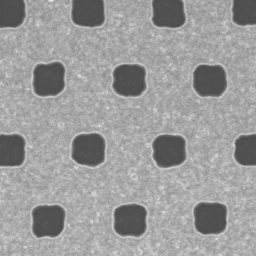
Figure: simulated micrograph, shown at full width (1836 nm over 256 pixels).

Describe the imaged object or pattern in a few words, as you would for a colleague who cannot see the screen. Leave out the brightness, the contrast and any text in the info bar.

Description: a regular array of holes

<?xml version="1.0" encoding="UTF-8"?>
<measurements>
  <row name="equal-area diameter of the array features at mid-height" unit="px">33.8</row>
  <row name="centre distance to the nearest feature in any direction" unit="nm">574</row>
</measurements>